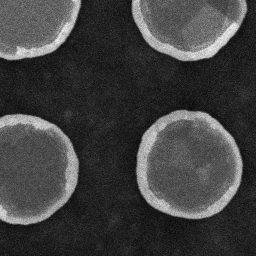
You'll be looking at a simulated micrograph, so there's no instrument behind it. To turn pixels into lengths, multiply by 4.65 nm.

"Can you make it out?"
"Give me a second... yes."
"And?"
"raised bodies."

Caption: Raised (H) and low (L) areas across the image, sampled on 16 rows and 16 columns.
HHHHHLLLHHHHHHHL
HHHHLLLLLHHHHHHL
HHHHLLLLLHHHHHLL
HHLLLLLLLLLHHLLL
LLLLLLLLLLLLLLLL
LLLLLLLLLLLLLLLL
LLLLLLLLLLLLLLLL
HHLLLLLLLLHHHLLL
HHHHLLLLLHHHHHLL
HHHHHLLLLHHHHHHL
HHHHHLLLLHHHHHHL
HHHHHLLLLHHHHHHL
HHHHLLLLLHHHHHLL
HHHLLLLLLLLLLLLL
LLLLLLLLLLLLLLLL
LLLLLLLLLLLLLLLL